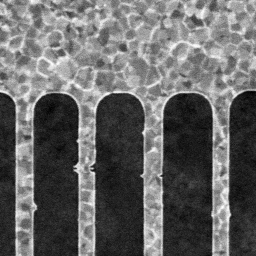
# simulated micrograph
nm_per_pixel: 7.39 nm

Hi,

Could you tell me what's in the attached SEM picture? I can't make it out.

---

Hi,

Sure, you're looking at one or a few lines or trenches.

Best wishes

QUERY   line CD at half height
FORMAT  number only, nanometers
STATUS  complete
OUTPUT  122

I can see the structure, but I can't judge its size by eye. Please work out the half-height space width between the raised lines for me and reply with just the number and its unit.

49.7 px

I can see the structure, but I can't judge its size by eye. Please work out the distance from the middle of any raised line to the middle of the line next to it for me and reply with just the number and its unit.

65.3 pixels